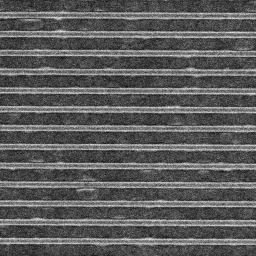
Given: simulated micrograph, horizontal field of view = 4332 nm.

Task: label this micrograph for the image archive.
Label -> parallel lines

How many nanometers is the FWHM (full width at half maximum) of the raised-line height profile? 88.8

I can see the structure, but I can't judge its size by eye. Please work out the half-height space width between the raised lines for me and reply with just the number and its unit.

226 nanometers